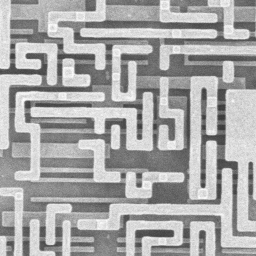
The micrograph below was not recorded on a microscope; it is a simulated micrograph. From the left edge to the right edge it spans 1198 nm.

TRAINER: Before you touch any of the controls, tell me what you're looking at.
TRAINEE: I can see wiring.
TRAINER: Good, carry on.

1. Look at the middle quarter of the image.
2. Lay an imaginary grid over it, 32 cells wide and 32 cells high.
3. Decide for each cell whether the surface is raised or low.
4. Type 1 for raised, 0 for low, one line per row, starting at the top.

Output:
11000000110011001100000011000000
11000000000011001100000000000000
11100000000011001100000000000000
11111100000011001100000011000000
11111100000011001100000011000000
00000000000011001100000011000000
00000000000011001100000011000000
11111111110011111100110011000000
11111111110011111100110011000000
00000000000000000000110011000000
00000000000000000000110011000000
11111111111111111100110011111000
11111111111111111100110011111100
00000000111000011100110000011100
00000000110000001100110000001100
00000000110011001100110011001100
00000000110011001100110011001100
00000000000011001100110011001100
00000000000011001100110011001100
00001111110011001111110011111100
00001111110011001111110011111100
00000001110000000000110000000000
00000000110000000000000000000000
00000000110000000000000000000001
00000000110000000000000000000001
00000000110000000000000000000001
00000000110000000000000000000001
00000000111111001100111111111101
00000000111111001100111111111101
00000000000000001100111000001001
00000000000000001100110000000001
00000000000000001111110000000001